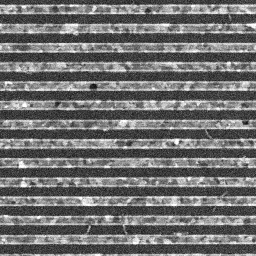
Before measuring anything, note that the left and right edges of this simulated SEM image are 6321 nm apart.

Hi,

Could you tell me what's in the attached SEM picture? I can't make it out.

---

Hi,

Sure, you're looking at parallel lines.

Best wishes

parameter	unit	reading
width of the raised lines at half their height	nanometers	198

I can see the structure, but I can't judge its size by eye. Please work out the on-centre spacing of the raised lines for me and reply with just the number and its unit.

474 nm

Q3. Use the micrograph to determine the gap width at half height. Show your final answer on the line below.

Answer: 287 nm